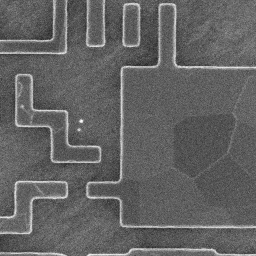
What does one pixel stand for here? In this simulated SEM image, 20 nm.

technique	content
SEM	wiring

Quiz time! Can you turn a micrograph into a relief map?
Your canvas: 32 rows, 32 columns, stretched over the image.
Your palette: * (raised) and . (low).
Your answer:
.......*...**...*...**..........
.......*...**..**...**..........
.......*...**..**...**..........
.......*...**..**...**..........
.......*...**..**...**..........
********...**...*...**..........
********............**..........
....................**..........
...............*****************
..**...........*****************
..**...........*****************
..**...........*****************
..**...........*****************
..**...........*****************
..******.......*****************
..******.......*****************
......**.......*****************
......**.......*****************
......******...*****************
......*******..*****************
...............*****************
...............*****************
...............*****************
..******...*********************
..******...*********************
..**...........*****************
..**...........*****************
****...........*****************
****............................
................................
................................
................***********.....